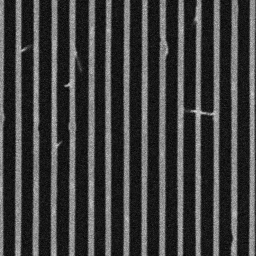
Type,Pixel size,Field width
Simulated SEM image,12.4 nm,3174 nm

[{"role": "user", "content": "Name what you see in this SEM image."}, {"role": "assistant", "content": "parallel lines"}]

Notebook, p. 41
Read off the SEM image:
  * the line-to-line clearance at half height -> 161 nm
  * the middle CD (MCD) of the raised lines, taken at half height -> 62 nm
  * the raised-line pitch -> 223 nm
